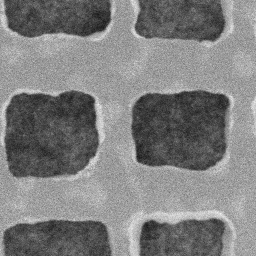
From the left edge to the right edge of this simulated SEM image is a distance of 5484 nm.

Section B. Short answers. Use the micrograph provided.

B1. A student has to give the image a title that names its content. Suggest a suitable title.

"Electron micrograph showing holes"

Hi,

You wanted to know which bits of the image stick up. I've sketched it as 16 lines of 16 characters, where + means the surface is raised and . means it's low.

.......++.....++
+......+......++
+++++++++++...++
++++++++++++++++
++++++++++++++++
++++++++++++++++
+.....++......++
......++......++
......++......++
......+++.....++
+....++++++..+++
++++++++++++++++
++++++++++++++++
++++++++++++++++
.......++.....++
.......++.....++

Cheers